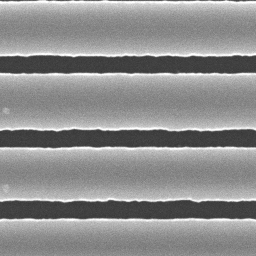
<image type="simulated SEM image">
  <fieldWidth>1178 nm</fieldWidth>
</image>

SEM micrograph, lines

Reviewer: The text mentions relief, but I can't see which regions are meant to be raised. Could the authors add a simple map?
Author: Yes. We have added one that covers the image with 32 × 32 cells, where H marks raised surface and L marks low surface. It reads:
HHHHHHHHHHHHHHHHHHHHHHHHHHHHHHHH
HHHHHHHHHHHHHHHHHHHHHHHHHHHHHHHH
HHHHHHHHHHHHHHHHHHHHHHHHHHHHHHHH
HHHHHHHHHHHHHHHHHHHHHHHHHHHHHHHH
HHHHHHHHHHHHHHHHHHHHHHHHHHHHHHHH
HHHHHHHHHHHHHHHHHHHHHHHHHHHHHHHH
HHHHHHHHHHHHHHHHHHHHHHHHHHHHHHHH
LLLLLLLLLLLLLLLLLLLLLLLLLLLLLLLL
LLLLLLLLLLLLLLLLLLLLLLLLLLLLLLLL
HHHHHHHHHHHHHHHHHHHHHHHHHHHHHHHH
HHHHHHHHHHHHHHHHHHHHHHHHHHHHHHHH
HHHHHHHHHHHHHHHHHHHHHHHHHHHHHHHH
HHHHHHHHHHHHHHHHHHHHHHHHHHHHHHHH
HHHHHHHHHHHHHHHHHHHHHHHHHHHHHHHH
HHHHHHHHHHHHHHHHHHHHHHHHHHHHHHHH
HHHHHHHHHHHHHHHHHHHHHHHHHHHHHHHH
LLLLLLLLLLLLLLLLLLLLLLLLLLLLLLLL
LLLLLLLLLLLLLLLLLLLLLLLLLLLLLLLL
LLLLLLLLLHHHLHHHLLHHHLLHLLHHHHLL
HHHHHHHHHHHHHHHHHHHHHHHHHHHHHHHH
HHHHHHHHHHHHHHHHHHHHHHHHHHHHHHHH
HHHHHHHHHHHHHHHHHHHHHHHHHHHHHHHH
HHHHHHHHHHHHHHHHHHHHHHHHHHHHHHHH
HHHHHHHHHHHHHHHHHHHHHHHHHHHHHHHH
HHHHHHHHHHHHHHHHHHHHHHHHHHHHHHHH
LLLLLLLLLLLLLLLLLLLLLLLLLLLLLLLL
LLLLLLLLLLLLLLLLLLLLLLLLLLLLLLLL
HHHHHHHHHHHHHHHHHHLHLHHHHHHHHHHH
HHHHHHHHHHHHHHHHHHHHHHHHHHHHHHHH
HHHHHHHHHHHHHHHHHHHHHHHHHHHHHHHH
HHHHHHHHHHHHHHHHHHHHHHHHHHHHHHHH
HHHHHHHHHHHHHHHHHHHHHHHHHHHHHHHH